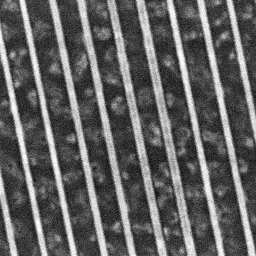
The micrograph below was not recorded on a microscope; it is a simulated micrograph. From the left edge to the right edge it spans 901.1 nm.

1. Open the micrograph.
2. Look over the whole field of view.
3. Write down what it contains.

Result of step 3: parallel lines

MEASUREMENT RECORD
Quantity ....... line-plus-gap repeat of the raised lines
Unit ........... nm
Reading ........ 102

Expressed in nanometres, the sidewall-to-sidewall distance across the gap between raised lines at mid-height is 81.6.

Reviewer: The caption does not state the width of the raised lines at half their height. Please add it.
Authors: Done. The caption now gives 19.4 nm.